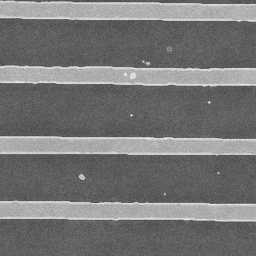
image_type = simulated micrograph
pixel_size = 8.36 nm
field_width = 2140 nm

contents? lines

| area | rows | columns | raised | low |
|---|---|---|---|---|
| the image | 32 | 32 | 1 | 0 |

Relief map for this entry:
11111111111111111111111110000000
11111111111111111111111111111111
00000000000000000000111111111111
00000000000000000000000000000000
00000000000000000000000000000000
00000000000000000000000000000000
00000000000000000000000000000000
00000000000000000000000000000000
11111111111111111000000000000000
11111111111111111111111111111111
00000000000000111111111111111111
00000000000000000000000000000000
00000000000000000000000000000000
00000000000000000000000000000000
00000000000000000000000000000000
00000000000000000000000000000000
00000000000000000000000000000000
11111111111111111111111111111111
11111111111111111111111111111111
00000000000000000000000000000000
00000000000000000000000000000000
00000000000000000000000000000000
00000000000000000000000000000000
00000000000000000000000000000000
00000000000000000000000000000000
11111111111111111111111111000000
11111111111111111111111111111111
00000000000000000000000000000011
00000000000000000000000000000000
00000000000000000000000000000000
00000000000000000000000000000000
00000000000000000000000000000000